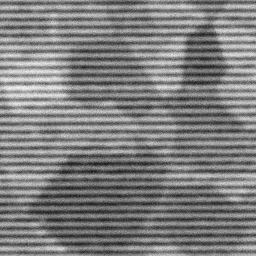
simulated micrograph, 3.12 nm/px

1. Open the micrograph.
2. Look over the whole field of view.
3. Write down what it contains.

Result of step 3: parallel lines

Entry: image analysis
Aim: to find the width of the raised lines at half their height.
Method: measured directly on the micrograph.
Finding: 4.87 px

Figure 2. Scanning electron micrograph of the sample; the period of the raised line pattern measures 8.04 pixels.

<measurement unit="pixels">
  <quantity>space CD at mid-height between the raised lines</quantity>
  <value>2.88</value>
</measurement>